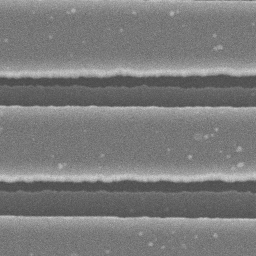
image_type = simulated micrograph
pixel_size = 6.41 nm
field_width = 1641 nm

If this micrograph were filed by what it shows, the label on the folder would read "lines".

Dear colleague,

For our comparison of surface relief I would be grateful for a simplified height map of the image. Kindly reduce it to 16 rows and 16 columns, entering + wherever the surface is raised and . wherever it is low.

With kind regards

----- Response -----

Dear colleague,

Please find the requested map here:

++++++++++++++++
++++++++++++++++
++++++++++++++++
++++++++++++++++
++++++++++++++++
................
................
++++++++++++++++
++++++++++++++++
++++++++++++++++
++++++++++++++++
................
................
................
++++++++++++++++
++++++++++++++++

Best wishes